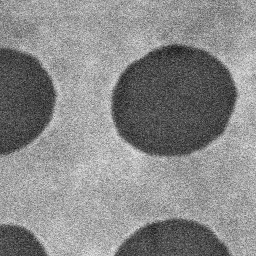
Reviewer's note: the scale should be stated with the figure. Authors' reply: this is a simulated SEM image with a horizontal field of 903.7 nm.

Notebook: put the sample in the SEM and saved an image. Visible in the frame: holes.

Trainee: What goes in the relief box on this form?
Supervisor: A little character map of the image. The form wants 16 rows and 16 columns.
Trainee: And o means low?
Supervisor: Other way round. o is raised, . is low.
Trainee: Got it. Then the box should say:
oooooooooooooooo
oooooooooooooooo
oooooooooooooooo
..ooooooo....ooo
...ooooo......oo
...oooo........o
...oooo........o
...oooo.......oo
..ooooo.......oo
.oooooooo...oooo
oooooooooooooooo
oooooooooooooooo
oooooooooooooooo
oooooooooooooooo
..oooooo.....ooo
...oooo.......oo